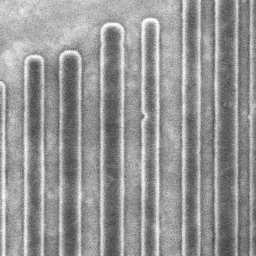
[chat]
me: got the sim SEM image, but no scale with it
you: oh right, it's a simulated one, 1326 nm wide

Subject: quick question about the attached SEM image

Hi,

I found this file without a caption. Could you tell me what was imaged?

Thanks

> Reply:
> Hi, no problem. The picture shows parallel lines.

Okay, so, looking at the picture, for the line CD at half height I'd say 97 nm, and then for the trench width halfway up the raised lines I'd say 101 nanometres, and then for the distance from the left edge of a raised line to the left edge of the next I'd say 197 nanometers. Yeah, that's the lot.